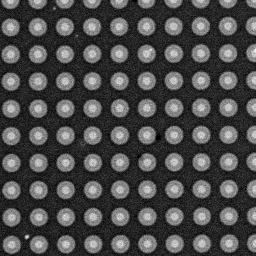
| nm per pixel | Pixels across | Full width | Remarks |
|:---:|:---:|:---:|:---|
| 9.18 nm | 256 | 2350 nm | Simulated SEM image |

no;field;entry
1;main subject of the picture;an array of small figures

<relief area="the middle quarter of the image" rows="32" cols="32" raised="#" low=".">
................................
................................
##....##.....##....###....###...
##...####...####...####..#####..
##...####...####...####..#####..
##...####...####...###....###...
................................
................................
................................
##....###...###....###....###...
##...####...####...####..#####..
##...####...####...####..#####..
##...####...####...###....###...
................................
................................
................................
##...####...####...####...###...
##...####...####...####..#####..
##...####...####...####..#####..
##....###...###....###....###...
................................
................................
.............##.....#......#....
##...####...####...####...####..
###..####...####...####..#####..
##...####...####...####...####..
##....##.....##.....##....###...
................................
................................
#.....##.....##.....##....###...
##...####...####...####...####..
###..####...####...####..#####..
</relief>